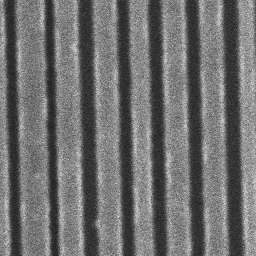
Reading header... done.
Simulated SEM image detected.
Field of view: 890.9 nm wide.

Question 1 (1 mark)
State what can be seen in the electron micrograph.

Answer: parallel lines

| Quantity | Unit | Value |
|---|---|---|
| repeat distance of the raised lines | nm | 126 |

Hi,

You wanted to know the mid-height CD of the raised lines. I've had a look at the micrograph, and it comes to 0.0853 µm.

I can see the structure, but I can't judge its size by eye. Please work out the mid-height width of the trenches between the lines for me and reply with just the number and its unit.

44.4 nanometers